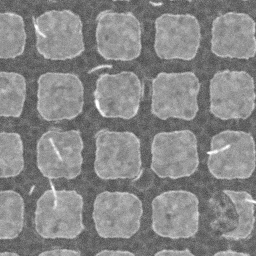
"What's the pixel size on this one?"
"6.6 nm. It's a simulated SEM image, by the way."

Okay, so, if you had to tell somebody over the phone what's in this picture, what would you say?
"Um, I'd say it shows a regular array of raised bodies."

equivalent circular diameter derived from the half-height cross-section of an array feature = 324 nm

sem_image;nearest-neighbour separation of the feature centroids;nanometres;383